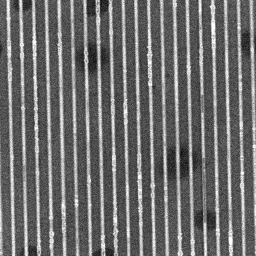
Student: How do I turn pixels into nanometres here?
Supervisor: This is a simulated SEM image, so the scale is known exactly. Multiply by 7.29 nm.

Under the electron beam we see parallel lines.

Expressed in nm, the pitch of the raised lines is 93.2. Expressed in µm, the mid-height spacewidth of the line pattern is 0.0783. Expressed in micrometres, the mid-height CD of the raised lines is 0.0191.